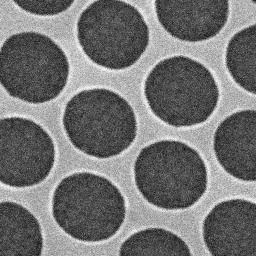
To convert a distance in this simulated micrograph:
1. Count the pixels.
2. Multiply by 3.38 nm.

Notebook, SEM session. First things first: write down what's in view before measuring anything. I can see holes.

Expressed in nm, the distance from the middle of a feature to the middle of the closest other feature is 285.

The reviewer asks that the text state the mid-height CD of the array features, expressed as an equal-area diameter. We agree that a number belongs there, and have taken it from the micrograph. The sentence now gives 247 nanometers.